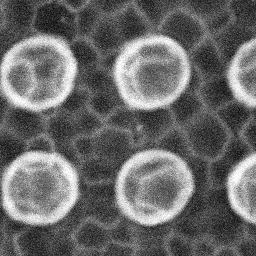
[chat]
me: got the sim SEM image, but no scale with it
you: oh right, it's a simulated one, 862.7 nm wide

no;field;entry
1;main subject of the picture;raised bodies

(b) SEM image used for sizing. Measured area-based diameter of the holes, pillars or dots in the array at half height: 241 nm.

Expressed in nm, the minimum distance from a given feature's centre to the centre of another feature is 386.